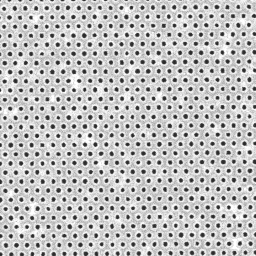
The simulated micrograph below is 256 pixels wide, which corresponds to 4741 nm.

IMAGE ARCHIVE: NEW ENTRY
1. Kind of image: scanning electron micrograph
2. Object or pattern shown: a regular array of holes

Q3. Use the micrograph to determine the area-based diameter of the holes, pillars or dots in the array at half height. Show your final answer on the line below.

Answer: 88.7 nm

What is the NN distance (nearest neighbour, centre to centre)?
190 nanometres